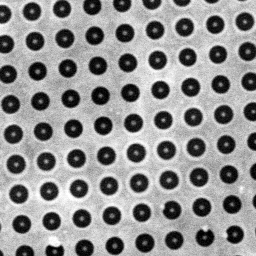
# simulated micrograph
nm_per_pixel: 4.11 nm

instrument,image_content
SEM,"an array of small figures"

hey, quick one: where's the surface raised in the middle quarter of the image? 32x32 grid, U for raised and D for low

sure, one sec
DDDUUUDDUDDUUUDDDDUUUDDDDUUUUUDD
DDDUUUDDDDDUUUDDDDUUUUUDUUUUUUUU
DDDUUUUDDUUUUUUUUUUUUUUUUUUUUUUU
DUUUUUUUUUUUUUUUUUUUUUUUUUUUUUUD
UUUUUUUUUUUUUUUUUUUUUUUDDDUUUUDD
UUUUUUUUUUUUUUUDDDUUUUDDDDUUUDDD
UDDUUUUDDDDUUUDDDDDUUUDDDDDUUDDD
DDDDUUUDDDDUUUDDUDDUUUDDDDUUUUDD
DUDDUUUDDDDUUUDDDDDUUUDDDUUUUUUU
DDDDUUUDDDDUUUUUDUUUUUUUUUUUUUUU
DDDUUUUUUUUUUUUUUUUUUUUUUUUUUUUU
UUUUUUUUUUUUUUUUUUUUUUUUUUUUUUDD
UUUUUUUUUUUUUUUUUDDUUUUDDDDUUUDD
UUUUUUUUDDDUUUUDDDDDUUDDDDDUUUDD
UDDDUUUUDDDDUUUDDUDDUUDDDDDUUUDD
DDDDDUUDDDDDUUUDDDDDUUUDDDDUUUUD
DDDDDUUUDDDDUUUDDDDUUUUUDDUUUUUU
DDDDUUUUDDDUUUUUUUUUUUUUUUUUUUUU
UUDUUUUUUUUUUUUUUUUUUUUUUUUUUUUU
UUUUUUUUUUUUUUUUUUDUUUUUDDDUUUUD
UUUUUUUUUUDUUUUUDDDDUUUDDDDDUUDD
UUDDUUUUUDDDDUUDDDDDDUUDDDDDUUDD
UDDDDUUUDDDDDUUDDDDDDUUDDDDDUUUD
DDDDDDUUDDDDDUUUDDDDDUUUDDDDUUUU
DDDDDUUUDDDDDUUUDDDDUUUUUUUUUUUU
UDDDDUUUUUDDUUUUUUUUUUUUUUUUUUUU
UUUUUUUUUUUUUUUUUUUUUUUUUDDUUUUU
UUUUUUUUUUUUUUUUUDDDDUUUDDDDDUUD
UUUDUUUUUDDDDUUUDDDDDUUDDDDDDUUD
UDDDDDUUUDDDDDUUDDDDDDUDDDDDDUUD
UDDDDDUUUDDDDDUUDDDDDDUUDDDDDUUU
UDDDDDUUUDDDDDUUUDDDDUUUUDDDUUUU